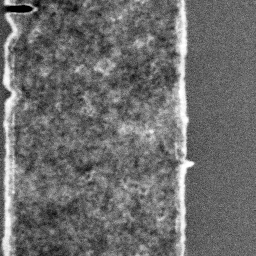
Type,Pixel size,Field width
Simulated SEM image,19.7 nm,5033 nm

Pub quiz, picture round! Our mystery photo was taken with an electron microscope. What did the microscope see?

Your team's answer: one or a few lines or trenches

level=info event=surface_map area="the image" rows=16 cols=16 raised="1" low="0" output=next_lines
0111111111100000
0111111111110000
0111111111100000
1111111111100000
1111111111100000
0111111111100000
1111111111110000
1111111111110000
1111111111110000
1111111111110000
1111111111110000
1111111111100000
1111111111100000
1111111111110000
1111111111100000
1111111111100000